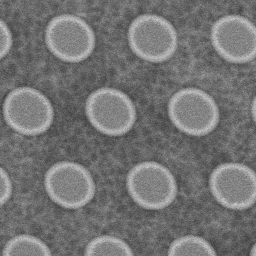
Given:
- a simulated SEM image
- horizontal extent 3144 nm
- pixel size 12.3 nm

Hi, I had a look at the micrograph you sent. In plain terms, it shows raised bodies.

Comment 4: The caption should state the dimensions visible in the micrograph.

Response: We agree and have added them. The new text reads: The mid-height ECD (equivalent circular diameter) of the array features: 550 nm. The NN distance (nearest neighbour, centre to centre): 1010 nm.